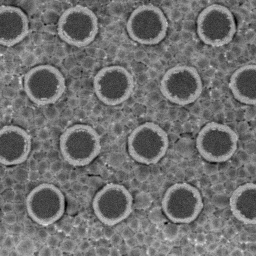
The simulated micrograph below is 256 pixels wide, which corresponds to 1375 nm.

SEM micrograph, a regular array of raised bodies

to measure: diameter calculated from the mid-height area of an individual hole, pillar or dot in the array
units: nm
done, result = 193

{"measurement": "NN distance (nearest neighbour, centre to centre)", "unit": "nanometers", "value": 364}